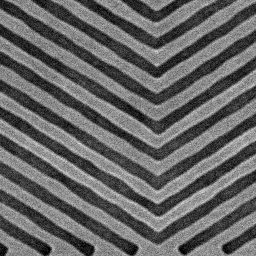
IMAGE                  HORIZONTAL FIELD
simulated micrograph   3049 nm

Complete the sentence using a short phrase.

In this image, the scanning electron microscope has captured groups of lines, slits or small figures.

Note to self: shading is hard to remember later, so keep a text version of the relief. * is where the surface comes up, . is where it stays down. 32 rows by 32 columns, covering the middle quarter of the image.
.******......*****..........****
...*****......*****.......******
.....*****......*****....******.
.......****.......****..*****...
**......*****......********.....
****......****......******......
*****......*****......**......**
..*****......****............***
...*****......*****........*****
.....*****......*****....******.
......******.....************...
**......******.....********.....
****.....*******....******.....*
*****......******.....**......**
..*****.....*******..........***
...*****......******.......*****
.....*****.....*******....****..
*......*****.....******.*****...
**......******.....********.....
****......******....*****.......
*****......******.....**......**
..*****......*****..........****
...******......*****.......*****
.....*****......******....****..
*......*****......*****.****....
***.....*****.......*******.....
****......*****......*****.....*
*****.......****......**......**
..*****.......****..........****
....*****......*****.......*****
......****......*****....*****..
*......*****......****..*****...